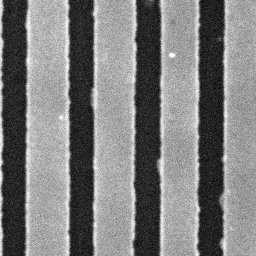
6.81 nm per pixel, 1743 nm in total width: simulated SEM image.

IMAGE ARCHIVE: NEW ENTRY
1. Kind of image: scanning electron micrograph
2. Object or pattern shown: lines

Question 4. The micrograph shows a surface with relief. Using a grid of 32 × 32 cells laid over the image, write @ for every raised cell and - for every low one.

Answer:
----@@@@----@@@@@---@@@@@---@@@@
---@@@@@----@@@@@---@@@@@---@@@@
---@@@@@----@@@@@---@@@@@---@@@@
---@@@@@----@@@@@---@@@@@---@@@@
---@@@@@@---@@@@@---@@@@@---@@@@
---@@@@@@---@@@@@---@@@@@---@@@@
---@@@@@----@@@@@---@@@@@---@@@@
---@@@@@@---@@@@@---@@@@@---@@@@
---@@@@@@---@@@@@---@@@@@---@@@@
---@@@@@----@@@@@---@@@@@---@@@@
---@@@@@@---@@@@@---@@@@@---@@@@
---@@@@@----@@@@@---@@@@@---@@@@
---@@@@@@---@@@@@---@@@@@---@@@@
---@@@@@@---@@@@@---@@@@@---@@@@
---@@@@@----@@@@@---@@@@@---@@@@
---@@@@@@---@@@@@---@@@@@---@@@@
---@@@@@@---@@@@@---@@@@@---@@@@
---@@@@@@---@@@@@---@@@@@---@@@@
---@@@@@@---@@@@@---@@@@@---@@@@
---@@@@@@---@@@@@---@@@@@---@@@@
---@@@@@@---@@@@@---@@@@@---@@@@
---@@@@@@---@@@@@---@@@@@---@@@@
---@@@@@@---@@@@@---@@@@@---@@@@
---@@@@@@---@@@@@---@@@@@---@@@@
---@@@@@@---@@@@@---@@@@@---@@@@
---@@@@@@---@@@@@---@@@@@---@@@@
---@@@@@@---@@@@@---@@@@@---@@@@
---@@@@@@---@@@@@---@@@@@---@@@@
---@@@@@@---@@@@@---@@@@@---@@@@
---@@@@@@---@@@@@---@@@@@---@@@@
---@@@@@@---@@@@@---@@@@@---@@@@
---@@@@@@---@@@@@---@@@@@---@@@@